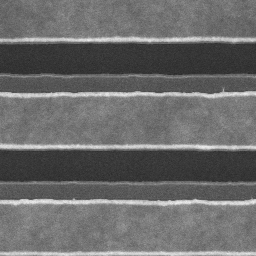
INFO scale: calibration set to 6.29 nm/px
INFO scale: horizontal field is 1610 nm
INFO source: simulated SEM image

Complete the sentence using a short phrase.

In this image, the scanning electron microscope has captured lines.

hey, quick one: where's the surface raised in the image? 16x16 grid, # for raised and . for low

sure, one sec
################
################
################
................
................
################
################
################
################
................
................
#########.###.##
################
################
################
################